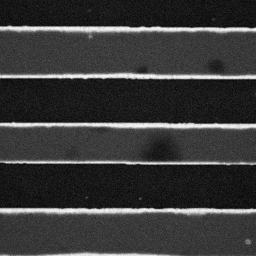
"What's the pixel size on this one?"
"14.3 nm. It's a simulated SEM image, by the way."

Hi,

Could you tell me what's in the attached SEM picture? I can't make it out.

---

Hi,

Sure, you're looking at lines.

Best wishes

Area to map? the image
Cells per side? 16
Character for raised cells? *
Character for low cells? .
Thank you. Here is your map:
................
................
****************
****************
****************
................
................
................
****************
****************
................
................
................
****************
****************
****************